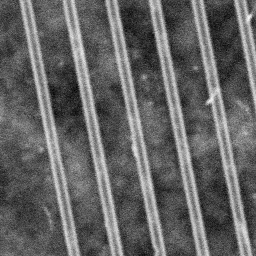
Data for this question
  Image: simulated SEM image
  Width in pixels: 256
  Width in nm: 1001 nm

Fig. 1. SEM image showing parallel lines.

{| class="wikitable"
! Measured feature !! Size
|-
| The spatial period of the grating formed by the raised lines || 165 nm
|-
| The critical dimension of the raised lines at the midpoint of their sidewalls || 0.0379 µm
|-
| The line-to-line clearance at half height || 128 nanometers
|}